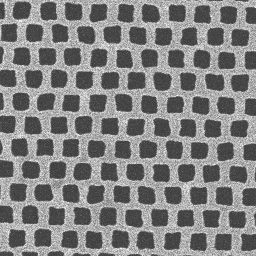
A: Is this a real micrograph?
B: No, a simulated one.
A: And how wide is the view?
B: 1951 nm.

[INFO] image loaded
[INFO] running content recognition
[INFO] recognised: a regular array of holes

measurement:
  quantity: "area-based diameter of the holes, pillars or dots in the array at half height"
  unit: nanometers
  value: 141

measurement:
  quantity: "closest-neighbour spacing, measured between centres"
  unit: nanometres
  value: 191